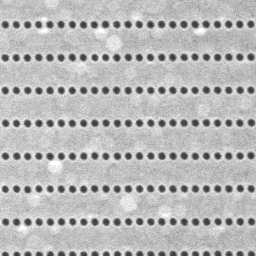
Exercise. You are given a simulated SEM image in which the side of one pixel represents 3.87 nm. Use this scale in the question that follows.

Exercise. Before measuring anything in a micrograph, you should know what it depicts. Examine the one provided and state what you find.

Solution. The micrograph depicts a regular array of holes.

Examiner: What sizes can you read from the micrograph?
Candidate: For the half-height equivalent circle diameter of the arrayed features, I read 31.2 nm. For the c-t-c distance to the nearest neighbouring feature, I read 42.1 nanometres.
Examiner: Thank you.